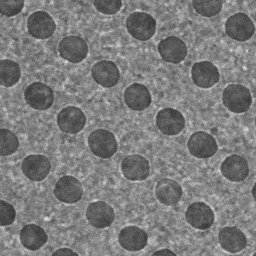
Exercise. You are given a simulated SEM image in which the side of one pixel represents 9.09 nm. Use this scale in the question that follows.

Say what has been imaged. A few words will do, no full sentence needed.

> a regular array of holes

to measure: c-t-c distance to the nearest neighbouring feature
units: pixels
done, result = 39.9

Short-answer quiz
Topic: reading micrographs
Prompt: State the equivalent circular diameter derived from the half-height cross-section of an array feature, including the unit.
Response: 268 nm